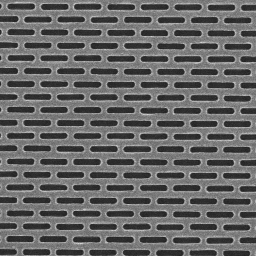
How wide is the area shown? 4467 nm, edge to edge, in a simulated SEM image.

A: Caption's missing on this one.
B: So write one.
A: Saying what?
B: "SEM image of a regular array of holes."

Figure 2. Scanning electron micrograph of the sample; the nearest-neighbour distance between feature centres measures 0.362 micrometres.